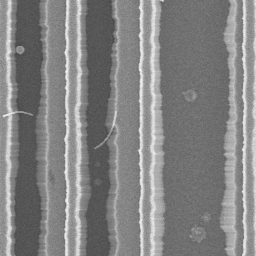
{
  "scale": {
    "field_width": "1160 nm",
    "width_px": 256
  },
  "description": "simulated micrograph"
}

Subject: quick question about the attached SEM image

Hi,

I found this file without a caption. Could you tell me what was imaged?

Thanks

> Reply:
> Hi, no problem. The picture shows lines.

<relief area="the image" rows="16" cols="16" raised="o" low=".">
o..oo..ooo.....o
o..oo..ooo.....o
o..oo..ooo....oo
o..oo..ooo.....o
o..oo..ooo.....o
o..oo..ooo.....o
o..oo..ooo.....o
o..oo..ooo.....o
o..oo..ooo.....o
o..oo..ooo.....o
o..oo..ooo.....o
o..oo..ooo.....o
o..oo..ooo....oo
o..oo..ooo....oo
o..oo..ooo.....o
o..oo..ooo.....o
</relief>